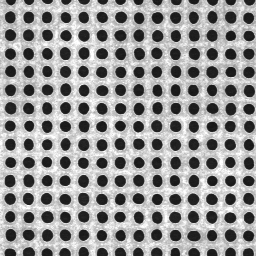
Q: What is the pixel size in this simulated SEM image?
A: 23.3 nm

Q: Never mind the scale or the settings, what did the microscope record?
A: a regular array of holes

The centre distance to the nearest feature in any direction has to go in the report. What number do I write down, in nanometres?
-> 415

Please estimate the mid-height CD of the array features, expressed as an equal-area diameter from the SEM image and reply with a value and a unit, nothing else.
11.6 pixels